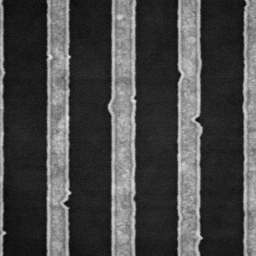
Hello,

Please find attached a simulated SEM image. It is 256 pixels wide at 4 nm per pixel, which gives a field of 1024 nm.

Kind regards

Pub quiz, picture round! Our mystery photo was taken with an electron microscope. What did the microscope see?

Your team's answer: one or a few lines or trenches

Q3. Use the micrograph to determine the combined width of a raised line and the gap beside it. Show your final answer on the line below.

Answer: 262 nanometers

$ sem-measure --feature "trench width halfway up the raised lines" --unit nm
182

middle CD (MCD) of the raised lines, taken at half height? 79.5 nanometers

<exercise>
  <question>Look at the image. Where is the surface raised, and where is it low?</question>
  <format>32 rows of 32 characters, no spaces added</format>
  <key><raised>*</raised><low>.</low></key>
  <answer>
......**......***.....***......*
......**......***.....***......*
......**......***.....***......*
......**......***.....***......*
......**......***.....***......*
......**......***.....***......*
......**......***.....***......*
......***.....***.....***......*
......**......***.....***......*
......**......***......**......*
......**......***.....***......*
......***.....***.....***......*
......**......***.....***......*
......**......***.....***......*
......**......***.....***......*
......**......***.....***......*
......**......***.....***......*
......**......***.....***......*
......**......***.....***......*
......**......***.....***......*
......**......***.....***......*
......**......***.....***......*
......**......***.....***......*
......***.....***.....***......*
......***.....***.....***......*
......**......***.....***......*
......**......***.....***......*
......**......***.....***......*
......**......***.....***......*
......**......***.....***......*
......**......***.....***......*
......**......***.....***......*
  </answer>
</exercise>